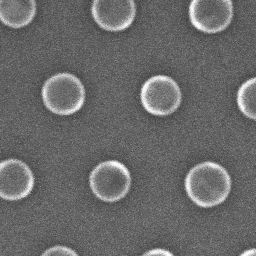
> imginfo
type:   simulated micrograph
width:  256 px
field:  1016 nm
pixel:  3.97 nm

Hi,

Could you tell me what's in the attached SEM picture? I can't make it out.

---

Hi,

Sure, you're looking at raised bodies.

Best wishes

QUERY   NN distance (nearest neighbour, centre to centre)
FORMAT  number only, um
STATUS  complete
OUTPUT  0.387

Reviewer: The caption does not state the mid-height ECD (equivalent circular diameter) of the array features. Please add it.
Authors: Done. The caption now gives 159 nanometres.